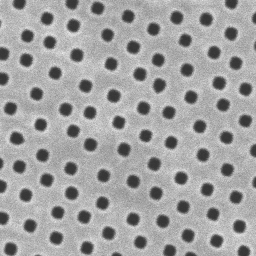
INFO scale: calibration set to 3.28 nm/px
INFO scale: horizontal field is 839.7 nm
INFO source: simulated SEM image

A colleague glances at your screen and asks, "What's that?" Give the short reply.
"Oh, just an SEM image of a regular array of holes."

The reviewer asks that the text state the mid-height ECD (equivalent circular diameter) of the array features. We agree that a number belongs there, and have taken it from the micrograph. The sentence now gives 42.3 nm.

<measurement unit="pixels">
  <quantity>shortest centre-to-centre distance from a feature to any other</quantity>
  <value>25.7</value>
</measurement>